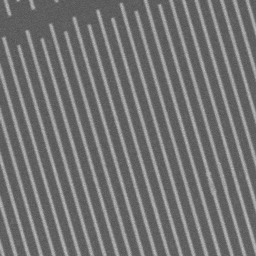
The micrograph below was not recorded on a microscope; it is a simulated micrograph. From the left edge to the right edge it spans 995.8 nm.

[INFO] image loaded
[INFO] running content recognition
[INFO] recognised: parallel lines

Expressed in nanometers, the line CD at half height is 10.8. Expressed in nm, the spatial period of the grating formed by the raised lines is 47.5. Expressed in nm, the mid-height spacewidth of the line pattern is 35.5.